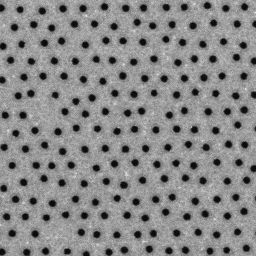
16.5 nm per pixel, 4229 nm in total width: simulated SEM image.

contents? a regular array of holes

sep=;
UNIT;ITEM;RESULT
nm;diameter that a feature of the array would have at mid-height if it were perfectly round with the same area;124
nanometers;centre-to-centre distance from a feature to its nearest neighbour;283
